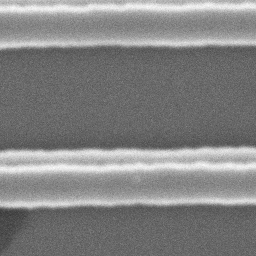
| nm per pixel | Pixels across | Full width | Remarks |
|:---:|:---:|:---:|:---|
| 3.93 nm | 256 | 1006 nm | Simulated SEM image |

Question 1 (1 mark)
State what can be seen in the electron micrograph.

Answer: lines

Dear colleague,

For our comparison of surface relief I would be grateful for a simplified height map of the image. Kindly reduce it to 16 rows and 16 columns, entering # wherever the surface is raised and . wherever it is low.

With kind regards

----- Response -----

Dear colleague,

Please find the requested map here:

################
################
################
................
................
................
................
................
................
################
################
################
################
................
................
................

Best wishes